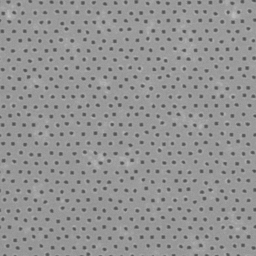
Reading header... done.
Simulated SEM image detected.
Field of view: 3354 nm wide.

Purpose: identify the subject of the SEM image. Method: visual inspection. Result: a regular array of holes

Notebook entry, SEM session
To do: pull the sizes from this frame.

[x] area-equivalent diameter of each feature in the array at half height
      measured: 55.3 nm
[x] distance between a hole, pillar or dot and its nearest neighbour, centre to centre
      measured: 121 nm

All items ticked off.